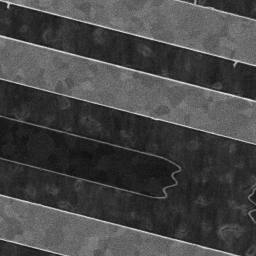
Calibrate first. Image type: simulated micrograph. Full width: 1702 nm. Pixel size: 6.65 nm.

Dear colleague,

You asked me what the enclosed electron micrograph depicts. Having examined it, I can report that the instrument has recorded one or a few lines or trenches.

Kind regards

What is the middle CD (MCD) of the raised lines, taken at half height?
41.9 pixels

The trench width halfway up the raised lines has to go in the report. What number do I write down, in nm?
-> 237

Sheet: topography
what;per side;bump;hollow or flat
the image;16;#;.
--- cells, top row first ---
..###########...
......##########
#.........######
#####.........##
#########.......
..###########...
......##########
#.........######
#####.........##
#########.......
..#########.....
......#####.....
#...............
#####...........
#########.......
..###########...